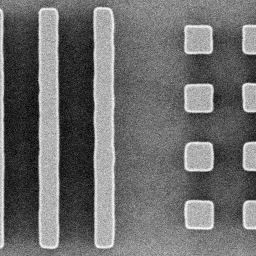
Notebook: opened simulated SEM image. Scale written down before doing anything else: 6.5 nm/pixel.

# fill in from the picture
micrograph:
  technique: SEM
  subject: groups of lines, slits or small figures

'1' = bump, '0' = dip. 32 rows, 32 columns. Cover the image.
00000000000000000000000000000000
00000110000011000000000000000000
00000110000011000000000000000000
00000110000011000000000111000011
00000110000011000000000111000011
00000110000011000000000111000011
00000110000011000000000111000001
00000110000011000000000000000000
00000110000011000000000000000000
00000110000011000000000000000000
00000110000011000000000000000001
00000110000011000000000111100011
00000110000011000000000111100011
00000110000011000000000111100011
00000110000011000000000000000000
00000110000011000000000000000000
00000110000011000000000000000000
00000110000011000000000000000000
00000110000011000000000111100011
00000110000011000000000111100011
00000110000011000000000111100011
00000110000011000000000000000000
00000110000011000000000000000000
00000110000011000000000000000000
00000110000011000000000000000000
00000110000011000000000111000001
00000110000011000000000111100011
00000110000011000000000111100011
00000110000011000000000011000001
00000110000011000000000000000000
00000110000011000000000000000000
00000000000000000000000000000000